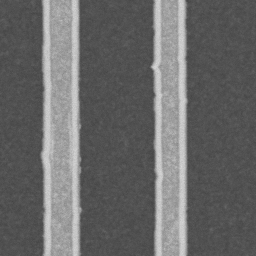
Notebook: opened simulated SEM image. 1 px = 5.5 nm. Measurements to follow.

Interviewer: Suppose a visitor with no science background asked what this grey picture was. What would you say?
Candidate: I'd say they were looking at one or a few lines or trenches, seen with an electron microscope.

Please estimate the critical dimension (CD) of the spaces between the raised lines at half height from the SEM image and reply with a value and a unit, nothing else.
462 nanometers